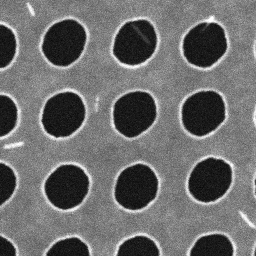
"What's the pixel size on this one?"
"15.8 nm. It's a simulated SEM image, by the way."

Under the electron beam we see a regular array of holes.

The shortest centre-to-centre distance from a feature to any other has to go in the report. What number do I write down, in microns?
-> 1.09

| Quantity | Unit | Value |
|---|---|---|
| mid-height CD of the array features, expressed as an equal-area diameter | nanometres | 711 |